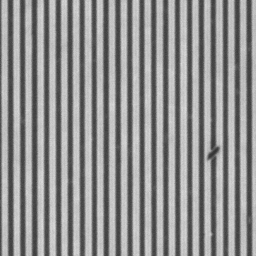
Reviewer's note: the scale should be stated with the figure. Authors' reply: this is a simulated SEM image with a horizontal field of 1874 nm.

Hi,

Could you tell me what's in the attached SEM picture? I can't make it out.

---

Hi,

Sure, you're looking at parallel lines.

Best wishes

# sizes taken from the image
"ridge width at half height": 0.0466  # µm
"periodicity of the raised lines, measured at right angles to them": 87.2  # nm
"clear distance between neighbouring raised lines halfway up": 0.0402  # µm